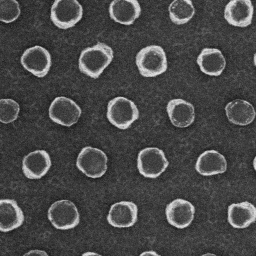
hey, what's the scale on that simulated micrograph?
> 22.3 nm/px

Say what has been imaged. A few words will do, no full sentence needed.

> a regular array of raised bodies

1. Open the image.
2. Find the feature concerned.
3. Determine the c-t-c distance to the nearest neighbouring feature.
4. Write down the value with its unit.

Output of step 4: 1260 nm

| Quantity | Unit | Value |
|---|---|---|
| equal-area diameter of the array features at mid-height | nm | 593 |